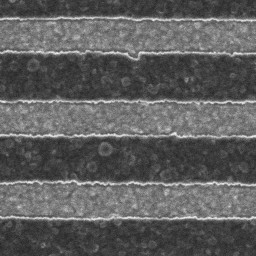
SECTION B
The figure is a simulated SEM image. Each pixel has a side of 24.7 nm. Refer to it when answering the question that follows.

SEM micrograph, one or a few lines or trenches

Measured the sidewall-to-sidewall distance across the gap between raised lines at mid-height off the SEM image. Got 817 nanometres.